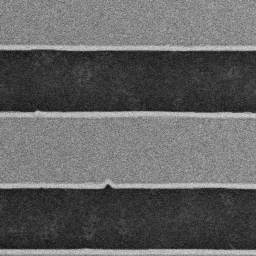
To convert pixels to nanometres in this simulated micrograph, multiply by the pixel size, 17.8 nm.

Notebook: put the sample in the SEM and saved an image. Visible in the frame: one or a few lines or trenches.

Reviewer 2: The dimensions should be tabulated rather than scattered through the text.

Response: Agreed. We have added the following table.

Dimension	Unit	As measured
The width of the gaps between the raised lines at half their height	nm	1190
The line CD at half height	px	71.4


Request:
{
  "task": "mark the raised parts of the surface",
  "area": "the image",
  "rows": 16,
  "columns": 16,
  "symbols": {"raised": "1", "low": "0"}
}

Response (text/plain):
1111111111111111
1111111111111111
1111111111111111
0000000000000000
0000000000000000
0000000000000000
0000000000000000
1111111111111111
1111111111111111
1111111111111111
1111111111111111
1111111111111111
0000000000000000
0000000000000000
0000000000000000
0000000000000000